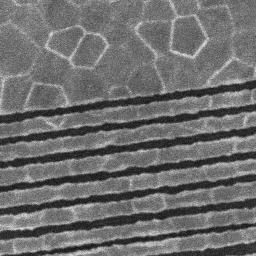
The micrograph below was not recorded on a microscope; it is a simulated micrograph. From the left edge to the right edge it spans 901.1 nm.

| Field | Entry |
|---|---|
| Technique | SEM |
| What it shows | parallel lines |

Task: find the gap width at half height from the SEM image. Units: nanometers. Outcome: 29.7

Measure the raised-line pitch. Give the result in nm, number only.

81.5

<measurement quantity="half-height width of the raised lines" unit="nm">51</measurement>